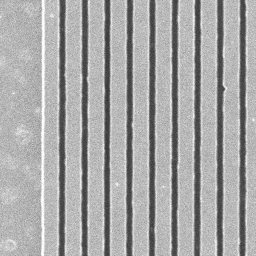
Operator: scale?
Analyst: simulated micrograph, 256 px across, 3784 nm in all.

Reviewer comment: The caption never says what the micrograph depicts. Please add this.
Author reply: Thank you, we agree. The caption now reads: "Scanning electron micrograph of parallel lines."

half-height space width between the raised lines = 94.2 nanometres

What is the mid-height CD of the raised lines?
242 nm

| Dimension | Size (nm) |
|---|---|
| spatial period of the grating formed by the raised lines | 333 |